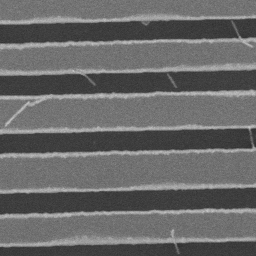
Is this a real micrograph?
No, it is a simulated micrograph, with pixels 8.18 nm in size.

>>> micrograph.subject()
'lines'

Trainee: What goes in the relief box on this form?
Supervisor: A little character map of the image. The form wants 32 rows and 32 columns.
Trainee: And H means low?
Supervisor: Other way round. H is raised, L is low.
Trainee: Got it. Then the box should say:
HHHHHHHHHHHHHHHHHHHHHHHHHHHHHHHH
HHHHHHHHHHHHHHHHHHHHHHHHHHHHHHHH
HHHHHHHHHHHHHHHHHHHLLLLLLLLLLLLL
LLLLLLLLLLLLLLLLLLLLLLLLLLLLLLLL
LLLLLLLLLLLLLLLLLLLLLLLLLLLLLLLL
LLLHHHHHHHHHHHHHHHHHHHHHHHHHHHHH
HHHHHHHHHHHHHHHHHHHHHHHHHHHHHHHH
HHHHHHHHHHHHHHHHHHHHHHHHHHHHHHHH
HHHHHHHHHHHHHHHHHHHHHHHHHHHHHHHH
LLLLLLLLLLLLLLLLLLLLLLLLLLLLLLLL
LLLLLLLLLLLLLLLLLLLLLLLLLLLLLLLL
LLLLLLLLLLLLLLLLLLLHLLLLHHHHHHHH
HHHHHHHHHHHHHHHHHHHHHHHHHHHHHHHH
HHHHHHHHHHHHHHHHHHHHHHHHHHHHHHHH
HHHHHHHHHHHHHHHHHHHHHHHHHHHHHHHH
HHHHHHHHHHHHHHHHHHHHHHHHHHHHHHHH
HHHHHHHHHLLLLLLLLLLLLLLLLLLLLLLL
LLLLLLLLLLLLLLLLLLLLLLLLLLLLLLLL
LLLLLLLLLLLLLLLLLLLLLLLLLLLLLLLH
HHHHHHHHHHHHHHHHHHHHHHHHHHHHHHHH
HHHHHHHHHHHHHHHHHHHHHHHHHHHHHHHH
HHHHHHHHHHHHHHHHHHHHHHHHHHHHHHHH
HHHHHHHHHHHHHHHHHHHHHHHHHHHHHHHH
HHHHHHHHHHHHHHHHHHHHHHHHLLLLLLLL
LLLLLLLLLLLLLLLLLLLLLLLLLLLLLLLL
LLLLLLLLLLLLLLLLLLLLLLLLLLLLLLLL
LLLLLLLLLLLLLHHHHHHHHHHHHHHHHHHH
HHHHHHHHHHHHHHHHHHHHHHHHHHHHHHHH
HHHHHHHHHHHHHHHHHHHHHHHHHHHHHHHH
HHHHHHHHHHHHHHHHHHHHHHHHHHHHHHHH
HHHHHHHHHHLHLLLLLLLLLLLLLLLLLLLL
LLLLLLLLLLLLLLLLLLLLLLLLLLLLLLLL